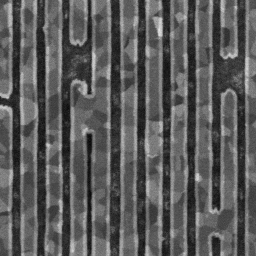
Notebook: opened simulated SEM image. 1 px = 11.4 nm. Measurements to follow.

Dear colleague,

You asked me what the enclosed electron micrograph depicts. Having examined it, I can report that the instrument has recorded parallel lines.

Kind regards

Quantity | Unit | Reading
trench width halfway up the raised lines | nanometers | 118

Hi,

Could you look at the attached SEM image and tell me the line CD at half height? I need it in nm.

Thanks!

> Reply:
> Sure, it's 163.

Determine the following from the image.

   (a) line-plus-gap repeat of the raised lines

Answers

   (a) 285 nanometers